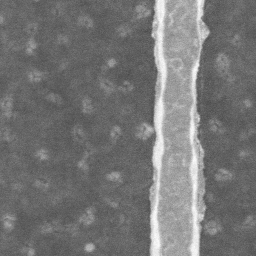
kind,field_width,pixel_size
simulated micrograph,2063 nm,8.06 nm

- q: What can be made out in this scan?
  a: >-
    one or a few lines or trenches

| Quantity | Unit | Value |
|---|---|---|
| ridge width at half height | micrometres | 0.296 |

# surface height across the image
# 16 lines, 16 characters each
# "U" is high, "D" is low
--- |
DDDDDDDDDDUUDDDD
DDDDDDDDDDUUDDDD
DDDDDDDDDDUUUDDD
DDDDDDDDDDUUDDDD
DDDDDDDDDDUUDDDD
DDDDDDDDDDUUDDDD
DDDDDDDDDDUUDDDD
DDDDDDDDDDUUDDDD
DDDDDDDDDDUUDDDD
DDDDDDDDDDUUDDDD
DDDDDDDDDDUUDDDD
DDDDDDDDDDUUDDDD
DDDDDDDDDDUUDDDD
DDDDDDDDDDUUDDDD
DDDDDDDDDDUUDDDD
DDDDDDDDDDUUDDDD